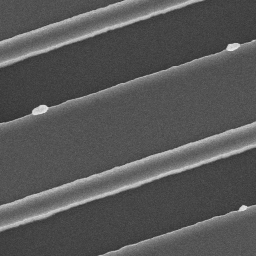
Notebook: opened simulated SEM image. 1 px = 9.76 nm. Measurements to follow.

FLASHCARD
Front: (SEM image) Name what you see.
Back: lines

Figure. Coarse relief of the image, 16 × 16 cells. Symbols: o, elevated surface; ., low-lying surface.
ooooooooooo.....
oooooooo........
ooooo...........
oo...........ooo
..........oooooo
.......ooooooooo
....oooooooooooo
.ooooooooooooooo
oooooooooooooooo
ooooooooooooooo.
oooooooooooo....
ooooooooo.......
ooooo...........
ooo...........oo
...........ooooo
........oooooooo